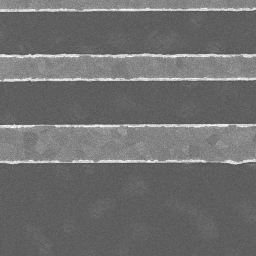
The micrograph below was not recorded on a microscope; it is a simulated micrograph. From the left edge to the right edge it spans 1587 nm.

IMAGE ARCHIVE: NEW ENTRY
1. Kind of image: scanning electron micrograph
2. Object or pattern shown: one or a few lines or trenches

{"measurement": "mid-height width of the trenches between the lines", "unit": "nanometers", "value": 273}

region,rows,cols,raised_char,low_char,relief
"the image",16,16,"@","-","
@@@@@@@@@@@@@@@@
----------------
----------------
@@@@@@@@@@@@@@@@
@@@@@@@@@@@@@@@@
----------------
----------------
----------------
@@@@@@@@@@@@@@@@
@@@@@@@@@@@@@@@@
----------------
----------------
----------------
----------------
----------------
----------------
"